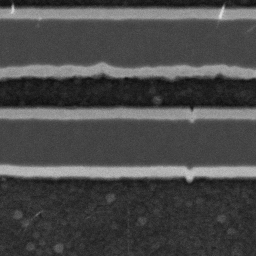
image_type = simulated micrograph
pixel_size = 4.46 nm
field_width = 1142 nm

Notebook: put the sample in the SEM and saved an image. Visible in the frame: one or a few lines or trenches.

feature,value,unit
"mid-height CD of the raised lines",255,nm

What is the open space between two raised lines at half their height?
191 nm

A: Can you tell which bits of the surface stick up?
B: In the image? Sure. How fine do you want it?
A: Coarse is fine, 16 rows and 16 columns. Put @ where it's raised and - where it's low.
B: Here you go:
----------------
@@@@@@@@@@@@@@@@
@@@@@@@@@@@@@@@@
@@@@@@@@@@@@@@@@
@@-----@@------@
----------------
----------------
@@@@@@@@@@@@@@@@
@@@@@@@@@@@@@@@@
@@@@@@@@@@@@@@@@
@@@@@@@@@@@@@@@@
----------------
----------------
----------------
----------------
----------------